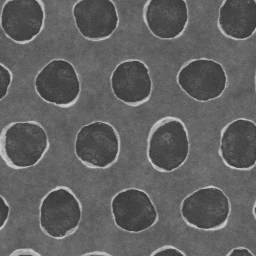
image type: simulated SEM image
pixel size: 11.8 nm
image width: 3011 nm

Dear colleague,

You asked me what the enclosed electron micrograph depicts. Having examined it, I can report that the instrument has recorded a regular array of holes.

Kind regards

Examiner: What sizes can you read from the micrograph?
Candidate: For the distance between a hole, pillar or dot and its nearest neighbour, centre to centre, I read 0.839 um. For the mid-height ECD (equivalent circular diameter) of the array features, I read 0.519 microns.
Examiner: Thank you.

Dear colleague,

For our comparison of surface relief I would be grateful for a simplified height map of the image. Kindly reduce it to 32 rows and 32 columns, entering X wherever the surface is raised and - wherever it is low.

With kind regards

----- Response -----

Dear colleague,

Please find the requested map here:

X----XXXXX----XXXX-----XXXXX----
-----XXXX------XXX-----XXXXX----
-----XXXX------XXX-----XXXX-----
-----XXXXX----XXXXX----XXXXX----
X---XXXXXX----XXXXXX--XXXXXXX--X
XXXXXXXXXXXXXXXXXXXXXXXXXXXXXXXX
XXXXXXXXXXXXXXXXXXXXXXXXXXXXXXXX
XXXXXXX-XXXXXXXXXXXXXXXXX-XXXXXX
-XXXXX---XXXXXX---XXXXX-----XXXX
-XXXX-----XXXX-----XXX------XXXX
-XXXX-----XXXX-----XXX------XXXX
-XXXX-----XXXX-----XXXX-----XXXX
XXXXXX---XXXXXX---XXXXXXX-XXXXXX
XXXXXXXXXXXXXXXXXXXXXXXXXXXXXXXX
XXXXXXXXXXXXXXXXXXXXXXXXXXXXXXXX
XX---XXXXXX--XXXXXXX---XXXXXX---
X-----XXXX----XXXXX----XXXXX----
------XXXX-----XXXX----XXXXX----
------XXX------XXX------XXXX----
X----XXXXX-----XXXX----XXXXX----
XX--XXXXXXX---XXXXX----XXXXXX---
XXXXXXXXXXXXXXXXXXXXXXXXXXXXXXXX
XXXXXXXXXXXXXXXXXXXXXXXXXXXXXXXX
XXXXXXXXXXXXXXXXXXXXXXXXXX-XXXXX
XXXXXX---XXXXXX---XXXXXX----XXXX
-XXXX-----XXXX-----XXXX------XXX
-XXXX-----XXXX-----XXXX------XXX
-XXXX-----XXXX-----XXXX-----XXXX
XXXXX-----XXXXX----XXXXXX--XXXXX
XXXXXX--XXXXXXXXXXXXXXXXXXXXXXXX
XXXXXXXXXXXXXXXXXXXXXXXXXXXXXXXX
XXXXXXXXXXXXXXXXXXXX--XXXXXXX--X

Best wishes